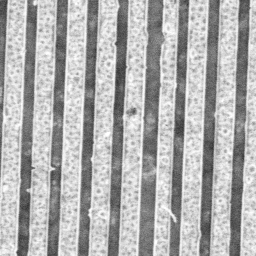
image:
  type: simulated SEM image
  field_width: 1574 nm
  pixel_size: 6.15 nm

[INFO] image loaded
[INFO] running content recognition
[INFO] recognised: parallel lines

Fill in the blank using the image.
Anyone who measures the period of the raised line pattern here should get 30.3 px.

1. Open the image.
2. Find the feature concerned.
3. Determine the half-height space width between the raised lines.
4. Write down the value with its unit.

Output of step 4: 74.5 nanometres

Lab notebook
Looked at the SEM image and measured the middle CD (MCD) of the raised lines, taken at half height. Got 109 nm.